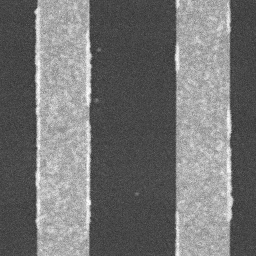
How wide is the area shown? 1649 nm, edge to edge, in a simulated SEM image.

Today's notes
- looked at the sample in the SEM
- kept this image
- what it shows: one or a few lines or trenches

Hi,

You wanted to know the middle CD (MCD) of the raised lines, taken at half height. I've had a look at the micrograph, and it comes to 342 nanometers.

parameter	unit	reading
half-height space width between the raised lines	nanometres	557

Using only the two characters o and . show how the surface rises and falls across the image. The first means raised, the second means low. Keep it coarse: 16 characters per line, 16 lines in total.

..oooo.....ooo..
..oooo.....ooo..
..oooo.....ooo..
..oooo.....ooo..
..oooo.....ooo..
..oooo.....ooo..
..oooo.....ooo..
..oooo.....ooo..
..oooo.....ooo..
..oooo.....ooo..
..oooo.....ooo..
..oooo.....ooo..
..oooo.....ooo..
..oooo.....ooo..
..ooo......ooo..
..ooo......ooo..